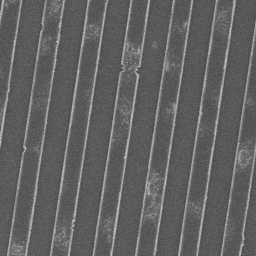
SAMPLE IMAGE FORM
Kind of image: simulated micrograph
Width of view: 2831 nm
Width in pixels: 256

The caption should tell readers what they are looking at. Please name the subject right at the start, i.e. parallel lines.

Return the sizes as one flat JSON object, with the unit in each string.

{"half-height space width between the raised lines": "268 nanometres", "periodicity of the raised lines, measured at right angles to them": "468 nm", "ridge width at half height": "0.205 micrometres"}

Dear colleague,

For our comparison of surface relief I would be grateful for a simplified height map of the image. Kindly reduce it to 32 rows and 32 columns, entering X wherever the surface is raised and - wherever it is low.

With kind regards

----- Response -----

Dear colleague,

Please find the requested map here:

XXX---XX---XX---XXX---XX---XX---
XX---XXX---XX---XX---XXX---XX---
XX---XXX---XX---XX---XXX---XX---
XX---XXX---XX---XX---XXX---XX---
XX---XX---XXX---XX---XX---XXX---
XX---XX---XXX---XX---XX---XXX---
XX---XX---XX---XXX---XX---XX---X
XX---XX---XX---XXX---XX---XX---X
X---XXX---XX---XX---XXX---XX---X
X---XXX---XX---XX---XXX---XX---X
X---XX----XX---XX---XX----XX---X
X---XX---XXX---XX---XX---XXX---X
X---XX---XX----XX---XX---XXX---X
X---XX---XX---XXX---XX---XX---XX
----XX---XX---XXX---XX---XX---XX
---XXX---XX---XX---XXX---XX---XX
---XXX---XX---XX---XXX---XX---XX
---XX----XX---XX---XX----XX---XX
---XX---XXX---XX---XX---XXX---XX
---XX---XX----XX---XX---XX----XX
---XX---XX---XXX---XX---XX---XXX
--XXX---XX---XX---XXX---XX---XXX
--XXX---XX---XX---XXX---XX---XX-
--XXX---XX---XX---XXX---XX---XX-
--XXX--XXX---XX---XX---XXX---XX-
--XX---XXX---XX---XX---XXX---XX-
--XX---XX---XXX---XX---XX---XXX-
--XX---XX---XXX---XX---XX---XXX-
-XXX---XX---XX---XXX---XX---XXX-
-XXX---XX---XX---XXX---XX---XX--
-XXX---XX---XX---XXX---XX---XX--
-XX---XXX---XX---XX---XXX---XX--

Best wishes